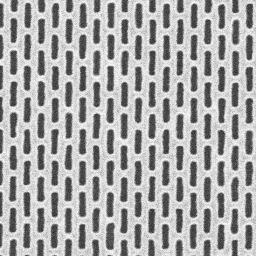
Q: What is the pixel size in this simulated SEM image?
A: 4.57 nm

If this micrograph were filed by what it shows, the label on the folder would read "a regular array of holes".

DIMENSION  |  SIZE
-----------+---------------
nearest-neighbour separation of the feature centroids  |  93.7 nm